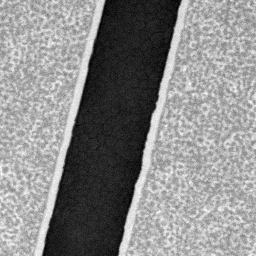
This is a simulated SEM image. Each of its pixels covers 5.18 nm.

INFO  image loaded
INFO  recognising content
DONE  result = one or a few lines or trenches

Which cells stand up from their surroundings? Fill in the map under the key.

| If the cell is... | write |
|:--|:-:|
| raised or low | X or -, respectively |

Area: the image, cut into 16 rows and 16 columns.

XXXXXX-----XXXXX
XXXXXX-----XXXXX
XXXXXX-----XXXXX
XXXXX------XXXXX
XXXXX------XXXXX
XXXXX-----XXXXXX
XXXXX-----XXXXXX
XXXX------XXXXXX
XXXX------XXXXXX
XXXX-----XXXXXXX
XXXX-----XXXXXXX
XXX------XXXXXXX
XXX-----XXXXXXXX
XXX-----XXXXXXXX
XXX-----XXXXXXXX
XXX-----XXXXXXXX